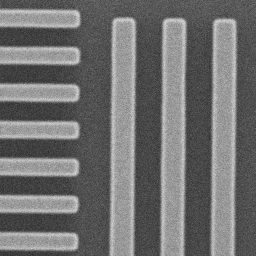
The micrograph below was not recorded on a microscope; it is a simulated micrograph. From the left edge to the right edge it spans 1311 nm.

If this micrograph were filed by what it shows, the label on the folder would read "groups of lines, slits or small figures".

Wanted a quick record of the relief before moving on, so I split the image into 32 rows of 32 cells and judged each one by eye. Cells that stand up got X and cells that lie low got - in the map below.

--------------------------------
XXXXXXXXXX----------------------
XXXXXXXXXX-----XX----XX---------
--------------XXX---XXX----XX---
--------------XXX---XXX----XX---
--------------XXX---XXX----XX---
XXXXXXXXXX----XXX---XXX----XX---
XXXXXXXXXX----XXX---XXX----XX---
--------------XXX---XXX----XX---
--------------XXX---XXX----XX---
--------------XXX---XXX----XX---
XXXXXXXXXX----XXX---XXX----XX---
XXXXXXXXXX----XXX---XXX----XX---
--------------XXX---XXX----XX---
--------------XXX---XXX----XX---
XXXXXXXXXX----XXX---XXX----XX---
XXXXXXXXXX----XXX---XXX----XX---
--------------XXX---XXX----XX---
--------------XXX---XXX----XX---
--------------XXX---XXX----XX---
XXXXXXXXXX----XXX---XXX----XX---
XXXXXXXXXX----XXX---XXX----XX---
--------------XXX---XXX----XX---
--------------XXX---XXX----XX---
XXX-----------XXX---XXX---XXX---
XXXXXXXXXX----XXX---XXX---XXX---
XXXXXXXXX-----XXX---XXX---XXX---
--------------XXX---XXX---XXX---
--------------XXX---XXX---XXX---
XXXXXXXXXX----XXX---XXX---XXX---
XXXXXXXXXX----XXX---XXX---XXX---
--------------XXX---XXX---XXX---